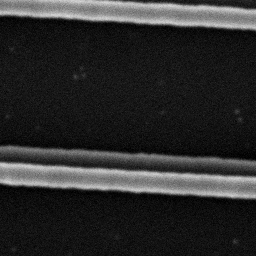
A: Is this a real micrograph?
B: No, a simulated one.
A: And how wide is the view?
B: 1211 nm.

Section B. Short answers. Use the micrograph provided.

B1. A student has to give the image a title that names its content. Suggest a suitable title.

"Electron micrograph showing lines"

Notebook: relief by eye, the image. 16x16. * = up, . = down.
****************
..........******
................
................
................
................
................
................
................
******..........
****************
****************
................
................
................
................